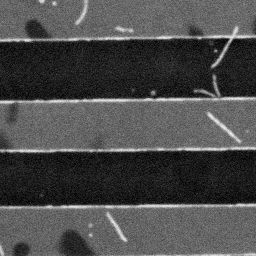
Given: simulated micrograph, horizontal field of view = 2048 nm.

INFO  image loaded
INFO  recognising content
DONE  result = lines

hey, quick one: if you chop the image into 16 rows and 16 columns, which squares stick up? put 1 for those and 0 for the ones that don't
1111111111111111
1111111111111111
1100000000000000
0000000000000000
0000000000000000
0000000000000000
1111111111111111
1111111111111111
1111111111111111
0000000000000000
0000000000000000
0000000000000000
0000000000000000
1111111111111111
1111111111111111
1111111111111111